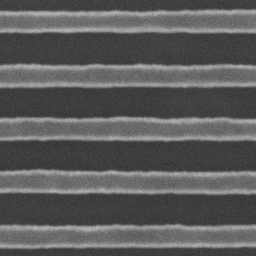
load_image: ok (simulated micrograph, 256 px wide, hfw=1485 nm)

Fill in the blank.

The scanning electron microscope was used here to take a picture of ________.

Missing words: lines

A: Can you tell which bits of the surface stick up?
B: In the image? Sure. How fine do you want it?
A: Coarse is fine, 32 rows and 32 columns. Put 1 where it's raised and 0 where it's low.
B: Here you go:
00000000000000000000000000000000
11111111101111111011111111111111
11111111111111111111111111111111
11111111111111111111111111111111
00000000000000000000000000000000
00000000000000000000000000000000
00000000000000000000000000000000
00000000000000000000000000000000
11111111111111111111111111111111
11111111111111111111111111111111
11111111111111111111111111111111
00000000000000000000000000000000
00000000000000000000000000000000
00000000000000000000000000000000
00000000000000000000000000000000
11111111111111111111111111111111
11111111111111111111111111111111
11010100001111111111111000111111
00000000000000000000000000000000
00000000000000000000000000000000
00000000000000000000000000000000
11111111111111111111100000000111
11111111111111111111111111111111
11111111111111111111111111111111
00000000000000000000000000000000
00000000000000000000000000000000
00000000000000000000000000000000
00000000000000000000000000000000
11111111111111111111111111111111
11111111111111111111111111111111
11111111111111111111111111111111
00000000000000000000000000000000